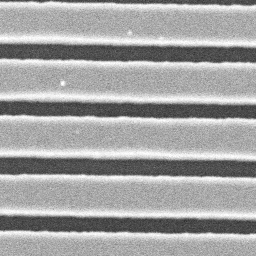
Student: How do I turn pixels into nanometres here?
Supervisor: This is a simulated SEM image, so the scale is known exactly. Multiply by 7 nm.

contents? lines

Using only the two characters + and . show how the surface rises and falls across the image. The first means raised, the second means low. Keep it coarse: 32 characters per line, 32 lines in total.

+++++++++++++++.................
++++++++++++++++++++++++++++++++
++++++++++++++++++++++++++++++++
++++++++++++++++++++++++++++++++
++++++++++++++++++++++++++++++++
...............+++++++++++++++++
................................
+++++...........................
++++++++++++++++++++++++++++++++
++++++++++++++++++++++++++++++++
++++++++++++++++++++++++++++++++
++++++++++++++++++++++++++++++++
..........++++++++++++++++++++++
................................
+.+.............................
++++++++++++++++++++++++++++++++
++++++++++++++++++++++++++++++++
++++++++++++++++++++++++++++++++
++++++++++++++++++++++++++++++++
......++++++++++++++++++++++++++
................................
................................
++++++++++++++++++++++++++++++++
++++++++++++++++++++++++++++++++
++++++++++++++++++++++++++++++++
++++++++++++++++++++++++++++++++
++++++++++++++++++++++++++++++++
................................
................................
++++++++++++++++++++++++++++++++
++++++++++++++++++++++++++++++++
++++++++++++++++++++++++++++++++